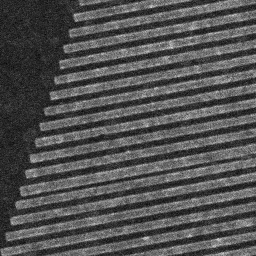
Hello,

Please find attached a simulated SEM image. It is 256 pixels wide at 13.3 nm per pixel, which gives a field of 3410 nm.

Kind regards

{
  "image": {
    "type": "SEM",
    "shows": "parallel lines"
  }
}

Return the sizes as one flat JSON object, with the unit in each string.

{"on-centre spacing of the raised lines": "194 nm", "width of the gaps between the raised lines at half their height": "0.0999 um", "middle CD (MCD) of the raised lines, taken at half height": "7.5 pixels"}